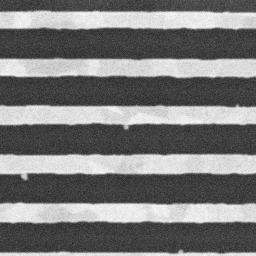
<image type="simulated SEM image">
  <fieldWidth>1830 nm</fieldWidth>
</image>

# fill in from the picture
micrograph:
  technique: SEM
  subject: lines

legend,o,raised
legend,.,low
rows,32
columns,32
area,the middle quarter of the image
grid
oooooooooooooooooooooooooooooooo
oooooooooooooooooooooooooooooooo
oooooooooooooooooooooooooooooooo
................................
................................
................................
................................
................................
................................
................................
................................
oooooooooooooooooooooooooooooooo
oooooooooooooooooooooooooooooooo
oooooooooooooooooooooooooooooooo
oooooooooooooooooooooooooooooooo
................................
................................
................................
................................
................................
................................
................................
................................
oooooooooooooooooooooooooooooooo
oooooooooooooooooooooooooooooooo
oooooooooooooooooooooooooooooooo
oooooooooooooooooooooooooooooooo
................................
................................
................................
................................
................................